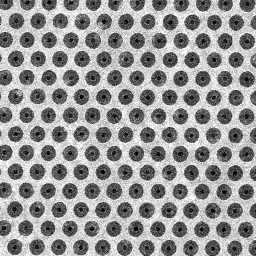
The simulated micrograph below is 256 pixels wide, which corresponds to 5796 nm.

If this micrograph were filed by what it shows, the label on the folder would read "a regular array of ring-shaped grooves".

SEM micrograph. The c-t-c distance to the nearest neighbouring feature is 0.488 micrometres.